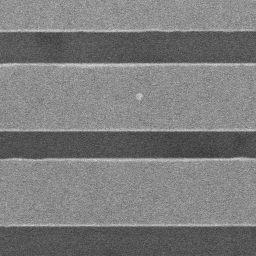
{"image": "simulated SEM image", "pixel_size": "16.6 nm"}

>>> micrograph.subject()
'lines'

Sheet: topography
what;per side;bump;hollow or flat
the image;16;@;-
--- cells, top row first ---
@@@@@@@@@@@@@@@@
@@@@@@@@@@@@@@@@
----------------
----------------
@@@@@@@@@@@@@@@@
@@@@@@@@@@@@@@@@
@@@@@@@@@@@@@@@@
@@@@@@@@@@@@@@@@
----------------
----------------
@@@@@@@@@@@@@@@@
@@@@@@@@@@@@@@@@
@@@@@@@@@@@@@@@@
@@@@@@@@@@@@@@@@
----------------
----------------